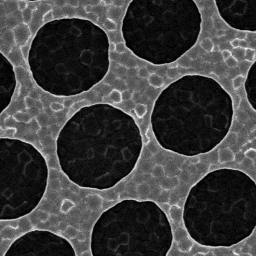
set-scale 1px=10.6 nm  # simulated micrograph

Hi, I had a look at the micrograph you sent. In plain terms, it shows holes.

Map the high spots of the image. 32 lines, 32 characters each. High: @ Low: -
@@@@@@@@@@@@@@@@--------@@@-----
@@@@@@@@@@@@@@@@---------@@-----
@@@@@@@----@@@@----------@@@----
@@@@@-------@@@----------@@@@---
@@@@---------@@----------@@@@@@@
@@@@----------@@--------@@@@@@@@
@@@@----------@@@------@@@@@@@@@
-@@@----------@@@@----@@@@@@@@@@
--@@----------@@@@@@@@@@@@@@@@@-
--@@---------@@@@@@@@@@--@@@@@@-
--@@@-------@@@@@@@@@------@@@@-
--@@@@----@@@@@@@@@@--------@@@-
-@@@@@@@@@@@@@@@@@@@---------@@-
-@@@@@@@@@-----@@@@----------@@@
@@@@@@@@@-------@@@----------@@@
@@@@@@@@---------@@----------@@@
@@@@@@@@---------@@---------@@@@
--@@@@@-----------@@--------@@@@
----@@@-----------@@-------@@@@@
-----@@----------@@@@@@-@@@@@@@@
------@----------@@@@@@@@@@@@@@@
------@@--------@@@@@@@@@@----@@
------@@@------@@@@@@@@@@-------
------@@@@@---@@@@@@@@@@--------
-----@@@@@@@@@@@@@@@@@@---------
-----@@@@@@@@@@----@@@@---------
----@@@@@@@@@-------@@@---------
@@@@@@@@@@@@---------@@---------
@@@@@@@@@@@@---------@@---------
@@@----@@@@-----------@@-------@
@@-------@@----------@@@@----@@@
@--------@@----------@@@@@@@@@@@